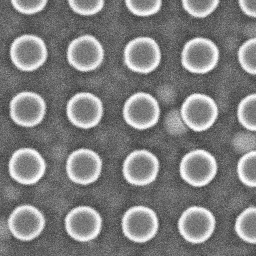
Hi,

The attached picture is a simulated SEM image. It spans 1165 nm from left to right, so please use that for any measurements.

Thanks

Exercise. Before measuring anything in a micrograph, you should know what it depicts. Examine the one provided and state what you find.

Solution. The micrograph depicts a regular array of raised bodies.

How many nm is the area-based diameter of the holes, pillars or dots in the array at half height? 154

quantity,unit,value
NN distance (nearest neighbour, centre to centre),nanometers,257